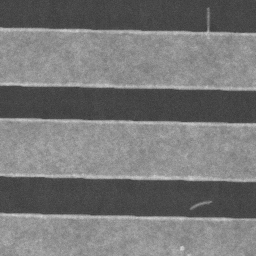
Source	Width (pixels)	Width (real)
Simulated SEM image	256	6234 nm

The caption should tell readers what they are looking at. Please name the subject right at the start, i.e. lines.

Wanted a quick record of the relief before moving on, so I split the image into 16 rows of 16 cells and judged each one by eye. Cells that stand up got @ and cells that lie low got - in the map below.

----------------
----------------
@@@@@@@@@@@@@@@@
@@@@@@@@@@@@@@@@
@@@@@@@@@@@@@@@@
-------@@@@@@@@@
----------------
@@@@@-----------
@@@@@@@@@@@@@@@@
@@@@@@@@@@@@@@@@
@@@@@@@@@@@@@@@@
----------------
----------------
@@@@@@----------
@@@@@@@@@@@@@@@@
@@@@@@@@@@@@@@@@